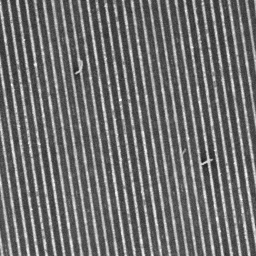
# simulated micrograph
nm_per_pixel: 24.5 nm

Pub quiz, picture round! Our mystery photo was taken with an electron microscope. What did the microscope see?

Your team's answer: parallel lines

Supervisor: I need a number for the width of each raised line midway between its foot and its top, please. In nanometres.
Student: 42.4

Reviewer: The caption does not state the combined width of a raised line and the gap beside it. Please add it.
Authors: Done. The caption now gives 214 nanometres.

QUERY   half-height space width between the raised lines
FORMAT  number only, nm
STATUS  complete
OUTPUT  173